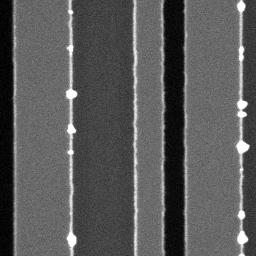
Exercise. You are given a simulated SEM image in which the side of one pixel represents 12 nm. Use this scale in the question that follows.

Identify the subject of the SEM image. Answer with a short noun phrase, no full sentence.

lines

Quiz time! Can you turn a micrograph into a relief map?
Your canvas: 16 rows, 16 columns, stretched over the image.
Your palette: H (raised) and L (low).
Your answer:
LHHHLLLLHHLLHHHL
LHHHLLLLHHLLHHHL
LHHHLLLLHHLLHHHL
LHHHLLLLHHLLHHHL
LHHHLLLLHHLLHHHL
LHHHHLLLHHLLHHHL
LHHHLLLLHHLLHHHL
LHHHLLLLHHLLHHHL
LHHHHLLLHHLLHHHL
LHHHLLLLHHLLHHHL
LHHHLLLLHHLLHHHL
LHHHLLLLHHLLHHHL
LHHHLLLLHHLLHHHL
LHHHLLLLHHLLHHHL
LHHHHLLLHHLLHHHL
LHHHHLLLHHLLHHHL